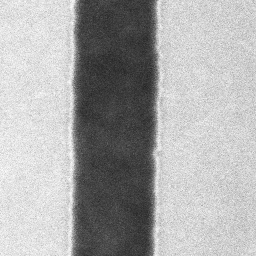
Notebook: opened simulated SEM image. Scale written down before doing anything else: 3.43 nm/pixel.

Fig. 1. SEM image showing one or a few lines or trenches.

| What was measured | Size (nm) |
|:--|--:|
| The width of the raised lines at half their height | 302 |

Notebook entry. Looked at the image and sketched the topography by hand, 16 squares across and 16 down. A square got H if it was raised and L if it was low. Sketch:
LLLLHHHHHHLLLLLL
LLLLHHHHHHLLLLLL
LLLLHHHHHHLLLLLL
LLLLLHHHHHLLLLLL
LLLLHHHHHHLLLLLL
LLLLHHHHHHLLLLLL
LLLLHHHHHHLLLLLL
LLLLHHHHHHLLLLLL
LLLLHHHHHHLLLLLL
LLLLHHHHHHLLLLLL
LLLLHHHHHHLLLLLL
LLLLHHHHHHLLLLLL
LLLLHHHHHHLLLLLL
LLLLHHHHHHLLLLLL
LLLLHHHHHHLLLLLL
LLLLHHHHHHLLLLLL